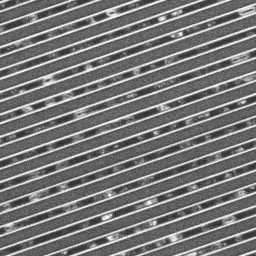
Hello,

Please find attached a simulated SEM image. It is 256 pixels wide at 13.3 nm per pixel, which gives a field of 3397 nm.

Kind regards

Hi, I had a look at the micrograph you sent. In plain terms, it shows parallel lines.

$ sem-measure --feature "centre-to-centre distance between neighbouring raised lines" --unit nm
282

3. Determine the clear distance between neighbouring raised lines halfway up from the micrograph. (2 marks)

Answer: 158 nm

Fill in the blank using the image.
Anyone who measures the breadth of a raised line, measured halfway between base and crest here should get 119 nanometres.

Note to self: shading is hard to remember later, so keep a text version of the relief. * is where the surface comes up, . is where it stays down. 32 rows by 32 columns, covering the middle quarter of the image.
...*******.........*******......
*******.........*******.........
****.........*******.........***
*.........*******.........******
.......*******.........*******..
.....******..........*******....
..******..........*******.......
******.........*******.........*
***.........*******..........***
.........*******..........******
......*******..........*******..
...*******..........*******.....
*******..........*******........
****..........*******.........**
**.........*******.........*****
........*******.........********
.....*******.........********...
..*******.........********......
******..........*******.........
***..........*******.........***
*.........*******.........******
.......*******..........******..
....********.........******.....
.********.........*******.......
******.........*******.........*
***.........*******.........****
.........*******.........*******
......*******.........*******...
...*******.........*******......
*******.........*******.........
****.........*******.........***
*..........******..........*****